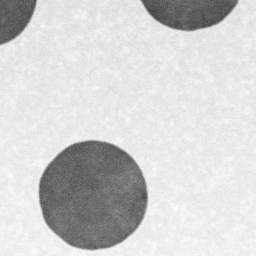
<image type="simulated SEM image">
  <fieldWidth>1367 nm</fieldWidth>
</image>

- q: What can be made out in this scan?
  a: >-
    holes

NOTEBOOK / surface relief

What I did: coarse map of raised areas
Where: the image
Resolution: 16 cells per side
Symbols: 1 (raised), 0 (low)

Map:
0011111110000001
0011111111000011
0111111111111111
1111111111111111
1111111111111111
1111111111111111
1111111111111111
1111111111111111
1111111111111111
1111000011111111
1110000001111111
1100000001111111
1100000001111111
1110000001111111
1110000011111111
1111100111111111